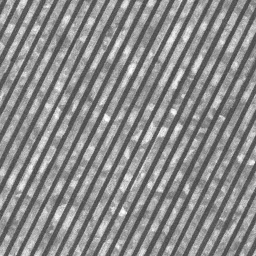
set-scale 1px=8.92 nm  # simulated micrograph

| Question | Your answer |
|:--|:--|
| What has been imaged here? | parallel lines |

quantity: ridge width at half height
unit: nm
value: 60.9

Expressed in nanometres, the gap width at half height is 45.8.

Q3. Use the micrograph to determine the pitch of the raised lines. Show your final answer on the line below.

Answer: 102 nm